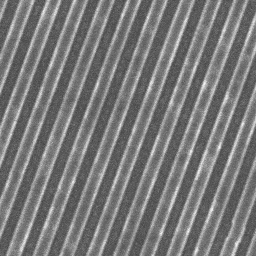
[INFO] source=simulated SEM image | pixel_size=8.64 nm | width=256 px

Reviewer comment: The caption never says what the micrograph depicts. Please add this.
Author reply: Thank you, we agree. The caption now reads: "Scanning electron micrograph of parallel lines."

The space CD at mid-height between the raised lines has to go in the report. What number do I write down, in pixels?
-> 12.6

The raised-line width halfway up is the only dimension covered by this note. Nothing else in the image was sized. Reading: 109 nm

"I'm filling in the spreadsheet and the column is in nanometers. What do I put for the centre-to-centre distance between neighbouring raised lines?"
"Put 216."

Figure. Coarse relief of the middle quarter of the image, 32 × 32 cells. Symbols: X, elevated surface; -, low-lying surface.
---XXX----XXX---XXXX---XXX----XX
---XXX---XXXX---XXX----XXX---XXX
--XXXX---XXX----XXX---XXXX---XXX
--XXX----XXX---XXXX---XXX----XXX
--XXX---XXXX---XXX----XXX---XXXX
-XXXX---XXX----XXX---XXXX---XXX-
-XXX----XXX---XXXX---XXX----XXX-
-XXX---XXX----XXX----XXX---XXX--
XXX----XXX---XXXX---XXX----XXX--
XXX---XXXX---XXX----XXX---XXXX--
XXX---XXX----XXX----XXX---XXX---
XX----XXX---XXXX---XXX----XXX---
XX---XXXX---XXX----XXX---XXXX---
XX---XXX----XXX---XXXX---XXX----
X----XXX---XXXX---XXX----XXX---X
X---XXXX---XXX----XXX---XXXX---X
X---XXX----XXX---XXX----XXX----X
---XXXX---XXX----XXX---XXXX---XX
---XXX----XXX---XXXX---XXX----XX
---XXX---XXXX---XXX----XXX---XXX
--XXXX---XXX----XXX---XXXX---XXX
--XXX----XXX---XXXX---XXX----XXX
--XXX---XXXX---XXX----XXX---XXXX
-XXXX---XXX----XXX---XXXX---XXXX
-XXX----XXX----XXX---XXX----XXX-
-XXX---XXXX---XXX----XXX---XXXX-
XXX----XXX----XXX---XXX----XXX--
XXX---XXXX---XXX----XXX---XXXX--
XXX---XXX----XXX---XXXX---XXXX--
XXX---XXX----XXX---XXXX---XXX---
XX---XXXX---XXX----XXX---XXXX---
XX---XXX----XXX---XXXX---XXXX---